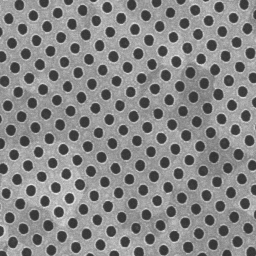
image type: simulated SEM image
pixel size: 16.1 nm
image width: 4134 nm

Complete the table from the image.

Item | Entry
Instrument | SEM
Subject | a regular array of holes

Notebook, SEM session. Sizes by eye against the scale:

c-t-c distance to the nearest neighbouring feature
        0.278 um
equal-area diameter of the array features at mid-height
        180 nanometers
